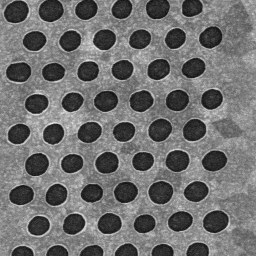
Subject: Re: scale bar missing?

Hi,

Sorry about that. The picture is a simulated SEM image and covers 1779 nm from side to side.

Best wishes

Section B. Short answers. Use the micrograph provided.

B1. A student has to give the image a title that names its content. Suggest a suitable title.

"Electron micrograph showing a regular array of holes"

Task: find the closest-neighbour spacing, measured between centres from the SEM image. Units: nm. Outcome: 239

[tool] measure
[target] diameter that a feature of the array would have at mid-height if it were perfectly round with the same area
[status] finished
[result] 0.156 micrometres